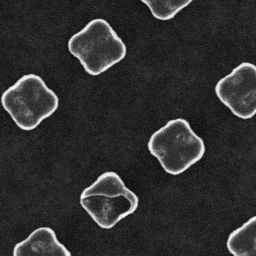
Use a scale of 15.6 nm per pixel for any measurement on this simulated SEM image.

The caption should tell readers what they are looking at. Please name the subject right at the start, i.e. raised bodies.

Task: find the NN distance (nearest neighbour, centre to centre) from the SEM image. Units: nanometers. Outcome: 1350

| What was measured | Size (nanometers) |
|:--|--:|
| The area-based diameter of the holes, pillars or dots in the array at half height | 771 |